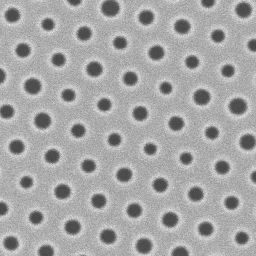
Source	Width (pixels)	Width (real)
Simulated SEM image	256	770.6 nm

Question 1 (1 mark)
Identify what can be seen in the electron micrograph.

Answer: a regular array of holes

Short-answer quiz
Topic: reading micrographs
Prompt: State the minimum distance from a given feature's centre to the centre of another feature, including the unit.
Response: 36.5 px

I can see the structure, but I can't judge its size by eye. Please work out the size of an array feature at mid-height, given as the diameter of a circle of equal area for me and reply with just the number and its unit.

43.7 nanometers